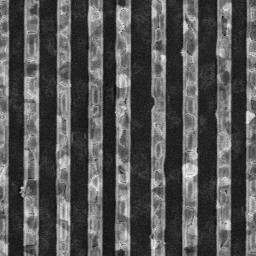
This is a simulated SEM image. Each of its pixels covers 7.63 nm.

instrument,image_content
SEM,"parallel lines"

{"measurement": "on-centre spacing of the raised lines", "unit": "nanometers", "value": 245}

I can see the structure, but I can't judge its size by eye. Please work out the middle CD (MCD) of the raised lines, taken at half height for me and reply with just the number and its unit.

94.4 nanometres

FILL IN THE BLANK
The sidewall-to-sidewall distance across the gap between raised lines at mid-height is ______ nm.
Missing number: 145